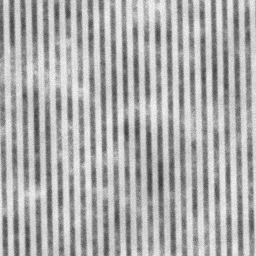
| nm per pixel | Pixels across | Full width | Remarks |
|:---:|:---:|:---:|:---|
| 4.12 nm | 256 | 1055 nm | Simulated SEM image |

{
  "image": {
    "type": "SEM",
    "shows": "parallel lines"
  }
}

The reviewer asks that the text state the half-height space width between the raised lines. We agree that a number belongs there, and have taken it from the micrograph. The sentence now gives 0.0252 micrometres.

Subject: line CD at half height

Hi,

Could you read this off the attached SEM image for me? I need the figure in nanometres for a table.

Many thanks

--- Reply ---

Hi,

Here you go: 21.6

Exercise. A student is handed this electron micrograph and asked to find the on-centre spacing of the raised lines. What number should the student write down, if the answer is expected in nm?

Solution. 46.1